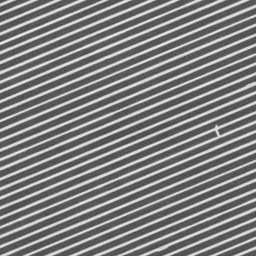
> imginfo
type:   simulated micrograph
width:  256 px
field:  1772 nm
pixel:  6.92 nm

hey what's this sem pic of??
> parallel lines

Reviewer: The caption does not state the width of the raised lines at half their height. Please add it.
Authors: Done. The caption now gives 17.6 nanometres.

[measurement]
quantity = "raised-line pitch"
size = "62 nanometres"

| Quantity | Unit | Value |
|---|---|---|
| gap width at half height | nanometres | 46.4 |